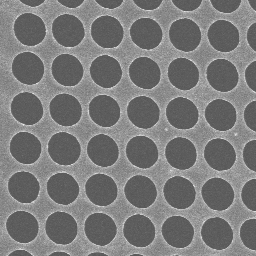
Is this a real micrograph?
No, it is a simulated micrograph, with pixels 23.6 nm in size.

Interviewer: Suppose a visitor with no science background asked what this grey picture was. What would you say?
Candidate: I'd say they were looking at a regular array of holes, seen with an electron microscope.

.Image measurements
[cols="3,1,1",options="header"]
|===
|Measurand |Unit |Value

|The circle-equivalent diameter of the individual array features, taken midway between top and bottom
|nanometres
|768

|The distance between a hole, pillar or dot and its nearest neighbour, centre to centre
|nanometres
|910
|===